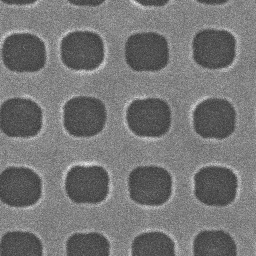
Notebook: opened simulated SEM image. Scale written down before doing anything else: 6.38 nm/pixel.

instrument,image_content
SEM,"a regular array of holes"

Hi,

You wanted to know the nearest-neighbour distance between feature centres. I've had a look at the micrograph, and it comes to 411 nm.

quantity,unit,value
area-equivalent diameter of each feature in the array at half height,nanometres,284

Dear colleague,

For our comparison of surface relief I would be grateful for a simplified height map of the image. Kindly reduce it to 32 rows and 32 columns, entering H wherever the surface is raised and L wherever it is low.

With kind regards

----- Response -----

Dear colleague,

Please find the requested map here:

HLLLHHHHHLLLLHHHHLLLLHHHHLLLHHHH
HHHHHHHHHHHHHHHHHHHHHHHHHHHHHHHH
HHHHHHHHHHHHHHHHHHHHHHHHHHHHHHHH
HHHHHHHHHHHHHHHHHHHHHHHHHHHHHHHH
HLLLLHHHLLLLLHHHLLLLHHHHLLLLLHHH
LLLLLLHHLLLLLHHHLLLLLHHHLLLLLLHH
LLLLLLHLLLLLLHHHLLLLLHHHLLLLLLHH
LLLLLLHHLLLLLHHHLLLLLHHHLLLLLHHH
HLLLLHHHHLLLHHHHLLLLHHHHHLLLHHHH
HHHHHHHHHHHHHHHHHHHHHHHHHHHHHHHH
HHHHHHHHHHHHHHHHHHHHHHHHHHHHHHHH
HHHHHHHHHHHHHHHHHHHHHHHHHHHHHHHH
HLLLHHHHHLLLHHHHHLLLHHHHHLLLHHHH
LLLLLHHHLLLLLHHHLLLLLHHHLLLLLHHH
LLLLLHHHLLLLLHHHLLLLLHHHLLLLLLHH
LLLLLHHHLLLLLHHHLLLLLHHHLLLLLLHH
LLLLLHHHLLLLLHHHLLLLLHHHLLLLLHHH
HHHHHHHHHHHHHHHHHHHHHHHHHHLLHHHH
HHHHHHHHHHHHHHHHHHHHHHHHHHHHHHHH
HHHHHHHHHHHHHHHHHHHHHHHHHHHHHHHH
HHHHHHHHHHHHHHHHHHHHHHHHHHHHHHHH
LLLLHHHHLLLLLHHHLLLLLHHHHLLLLHHH
LLLLLHHHLLLLLLHHLLLLLLHHLLLLLLHH
LLLLLHHHLLLLLLHHLLLLLLHHLLLLLLHH
LLLLLHHHLLLLLHHHLLLLLHHHLLLLLLHH
HLLLHHHHHHHLHHHHHLLLLHHHHLLLLHHH
HHHHHHHHHHHHHHHHHHHHHHHHHHHHHHHH
HHHHHHHHHHHHHHHHHHHHHHHHHHHHHHHH
HHHHHHHHHHHHHHHHHHHHHHHHHHHHHHHH
LLLLLHHHHLLLLHHHHLLLLHHHLLLLLHHH
LLLLLHHHLLLLLLHHLLLLLLHHLLLLLLHH
LLLLLLHHLLLLLLHHLLLLLLHHLLLLLLHH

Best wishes